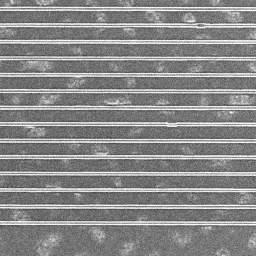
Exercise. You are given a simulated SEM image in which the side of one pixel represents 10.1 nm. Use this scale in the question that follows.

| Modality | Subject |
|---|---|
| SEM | parallel lines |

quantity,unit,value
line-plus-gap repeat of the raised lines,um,0.168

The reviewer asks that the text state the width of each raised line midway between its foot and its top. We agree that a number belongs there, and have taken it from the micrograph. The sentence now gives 29.1 nm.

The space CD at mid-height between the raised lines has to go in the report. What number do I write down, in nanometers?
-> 138